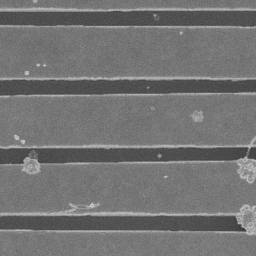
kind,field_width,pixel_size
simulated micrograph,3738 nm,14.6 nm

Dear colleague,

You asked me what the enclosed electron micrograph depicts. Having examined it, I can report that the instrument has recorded lines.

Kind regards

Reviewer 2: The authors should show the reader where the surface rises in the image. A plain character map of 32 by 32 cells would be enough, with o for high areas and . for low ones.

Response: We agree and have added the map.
oooooooooooooooooooooooooooooooo
................................
................................
oooooooooooooooooooooooooooooooo
oooooooooooooooooooooooooooooooo
oooooooooooooooooooooooooooooooo
oooooooooooooooooooooooooooooooo
oooooooooooooooooooooooooooooooo
oooooooooooooooooooooooooooooooo
oooooooooooooooooooooooooooooooo
................................
................................
oooooooooooooooooooooooooooooooo
oooooooooooooooooooooooooooooooo
oooooooooooooooooooooooooooooooo
oooooooooooooooooooooooooooooooo
oooooooooooooooooooooooooooooooo
oooooooooooooooooooooooooooooooo
................................
................................
..ooo...oooooooooooooooooooooooo
oooooooooooooooooooooooooooooooo
oooooooooooooooooooooooooooooooo
oooooooooooooooooooooooooooooooo
oooooooooooooooooooooooooooooooo
oooooooooooooooooooooooooooooooo
oooooooooooooooooooooooooooooooo
..............................oo
..............................oo
oooooooooooooooooooooooooooooooo
oooooooooooooooooooooooooooooooo
oooooooooooooooooooooooooooooooo